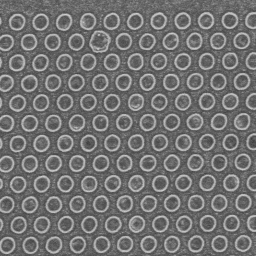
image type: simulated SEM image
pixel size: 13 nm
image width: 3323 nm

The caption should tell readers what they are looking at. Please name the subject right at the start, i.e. a regular array of raised bodies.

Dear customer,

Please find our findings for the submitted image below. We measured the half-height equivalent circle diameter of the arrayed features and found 195 nm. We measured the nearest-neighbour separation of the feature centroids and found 301 nm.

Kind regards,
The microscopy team